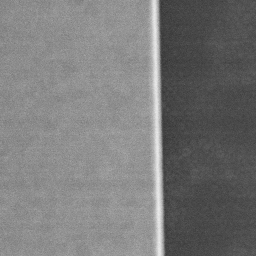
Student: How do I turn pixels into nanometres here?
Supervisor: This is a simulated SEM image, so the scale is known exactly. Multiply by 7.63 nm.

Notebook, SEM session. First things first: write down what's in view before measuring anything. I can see one or a few lines or trenches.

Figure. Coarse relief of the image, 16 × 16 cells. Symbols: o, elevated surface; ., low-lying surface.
oooooooooo......
oooooooooo......
oooooooooo......
oooooooooo......
oooooooooo......
oooooooooo......
oooooooooo......
oooooooooo......
oooooooooo......
oooooooooo......
oooooooooo......
oooooooooo......
oooooooooo......
oooooooooo......
oooooooooo......
oooooooooo......